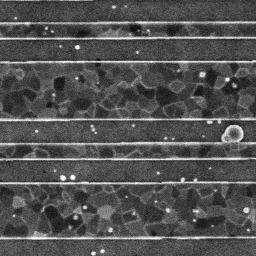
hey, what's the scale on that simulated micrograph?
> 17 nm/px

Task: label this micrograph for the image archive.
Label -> lines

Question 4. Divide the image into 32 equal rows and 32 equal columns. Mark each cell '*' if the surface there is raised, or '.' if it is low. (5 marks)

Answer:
................................
................................
................................
********************************
********************************
................................
................................
................................
********************************
********************************
********************************
********************************
********************************
********************************
********************************
................................
............................**..
............................**..
********************************
********************************
................................
................................
................................
********************************
********************************
********************************
********************************
********************************
********************************
********************************
................................
................................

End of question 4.